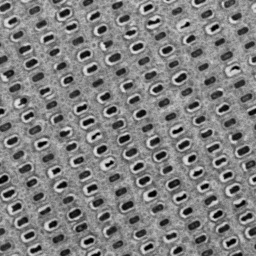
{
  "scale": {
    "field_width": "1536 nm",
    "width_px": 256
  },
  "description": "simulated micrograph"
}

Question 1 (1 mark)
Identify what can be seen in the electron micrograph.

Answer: a regular array of holes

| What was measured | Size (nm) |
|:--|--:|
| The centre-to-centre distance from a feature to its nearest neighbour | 91.9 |